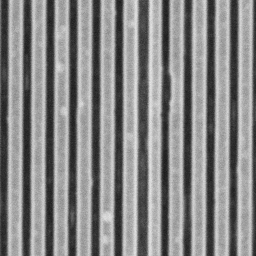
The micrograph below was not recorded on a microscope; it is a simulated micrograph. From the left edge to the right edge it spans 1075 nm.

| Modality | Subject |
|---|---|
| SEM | parallel lines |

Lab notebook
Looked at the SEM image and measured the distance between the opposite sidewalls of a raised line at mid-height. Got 54.1 nm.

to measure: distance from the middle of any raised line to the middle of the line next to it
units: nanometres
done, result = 96.6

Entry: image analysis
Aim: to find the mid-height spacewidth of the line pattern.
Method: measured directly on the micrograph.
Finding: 43.1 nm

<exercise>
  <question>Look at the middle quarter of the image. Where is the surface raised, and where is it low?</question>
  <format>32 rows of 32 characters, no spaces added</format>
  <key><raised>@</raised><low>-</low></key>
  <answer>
@---@@@--@@@---@@@----@@---@@@--
@---@@@--@@@---@@@----@@---@@@--
@---@@@--@@@---@@@----@@---@@@--
@---@@@--@@@---@@@----@@---@@@--
@---@@@--@@@---@@@----@@---@@---
@---@@@--@@@---@@@----@@---@@---
@---@@@--@@@---@@@----@@---@@---
@---@@@--@@@---@@@----@@---@@---
@---@@@--@@@---@@@----@@---@@---
@---@@---@@@---@@@----@@---@@---
@---@@@--@@@---@@@----@@---@@---
@---@@@--@@@---@@@----@@---@@---
@---@@@--@@@---@@@----@@--@@@---
@---@@@--@@@---@@@----@@--@@@---
@---@@@--@@@---@@@----@@--@@@---
@--@@@@--@@@---@@@----@@--@@@---
@--@@@@--@@@---@@@----@@--@@@---
@--@@@@--@@@---@@@----@@--@@@---
@--@@@@--@@@---@@@----@@--@@@---
@---@@@--@@@---@@@----@@--@@@---
@---@@@--@@@---@@@----@@--@@@---
@---@@@--@@@---@@@----@@--@@@---
@---@@@--@@@---@@@----@@--@@@---
@--@@@@--@@@---@@@----@@--@@@---
@--@@@@--@@@---@@@---@@@--@@@---
@--@@@---@@@---@@@---@@@--@@@---
@--@@@---@@@---@@@---@@@--@@@---
@--@@@@--@@@---@@@---@@@---@@---
@--@@@@--@@@---@@@---@@@---@@---
@---@@@--@@@---@@@---@@@---@@---
@---@@@--@@@---@@@---@@@---@@---
@--@@@@--@@@---@@@---@@@---@@---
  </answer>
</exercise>